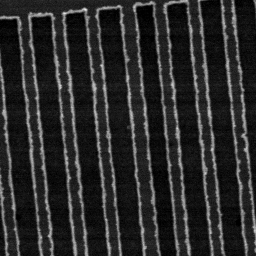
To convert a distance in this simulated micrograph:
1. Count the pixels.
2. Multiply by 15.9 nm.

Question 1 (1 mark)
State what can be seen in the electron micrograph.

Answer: parallel lines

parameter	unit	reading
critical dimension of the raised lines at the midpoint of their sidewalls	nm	204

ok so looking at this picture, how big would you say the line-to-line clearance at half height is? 344 nanometers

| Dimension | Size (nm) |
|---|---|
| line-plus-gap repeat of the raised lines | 541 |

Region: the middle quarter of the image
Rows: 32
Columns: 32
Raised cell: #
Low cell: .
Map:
#......###......###.....###.....
#......###......###.....###.....
#......###......####....###.....
##.....###......###.....###.....
##.....###......####....###.....
##.....###......####.....##.....
##......##......####.....###....
##.....###......####.....###....
##.....####.....####.....###....
##......###.....####....####....
##......###.....####.....###....
##......###......###.....###....
##......###......###.....###....
##......###......####....###....
##......###......####....###....
##......###......####....####...
##......###......####....####...
###.....###......####....####...
###......##......####.....###...
###......##......####.....###...
###......###.....####.....###...
###......###......###.....###...
###......###......###.....###...
.##......###......###.....###...
.##......###......###.....###...
.###.....###......###.....###...
.###.....###......####....###...
.###.....####.....####....###...
.###.....###......####....####..
.###......###.....####.....###..
.###......###......###.....###..
.###......###.....####.....###..